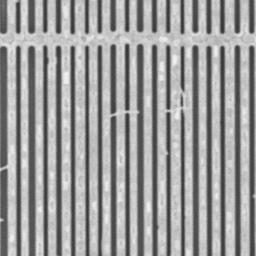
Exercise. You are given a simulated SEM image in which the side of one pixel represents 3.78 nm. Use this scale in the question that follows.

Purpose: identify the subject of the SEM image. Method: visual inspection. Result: parallel lines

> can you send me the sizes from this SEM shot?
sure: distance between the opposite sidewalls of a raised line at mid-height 35.4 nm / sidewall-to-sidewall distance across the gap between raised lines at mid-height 17.5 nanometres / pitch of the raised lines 0.0518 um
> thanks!